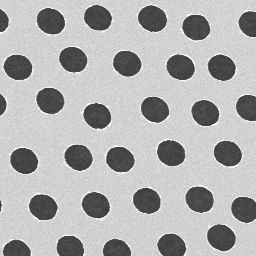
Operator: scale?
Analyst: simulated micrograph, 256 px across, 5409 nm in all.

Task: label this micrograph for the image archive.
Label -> a regular array of holes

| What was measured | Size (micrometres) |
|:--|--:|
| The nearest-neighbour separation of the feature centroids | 0.98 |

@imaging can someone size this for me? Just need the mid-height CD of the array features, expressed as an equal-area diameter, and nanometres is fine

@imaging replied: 574